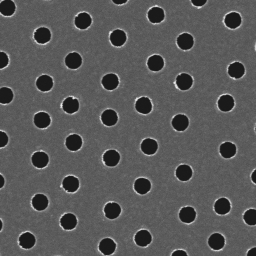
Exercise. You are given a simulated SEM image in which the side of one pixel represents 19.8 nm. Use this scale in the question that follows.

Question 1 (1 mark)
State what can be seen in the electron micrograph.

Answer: a regular array of holes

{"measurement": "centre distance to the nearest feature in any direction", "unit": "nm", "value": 726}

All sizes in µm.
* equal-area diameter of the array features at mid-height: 0.333